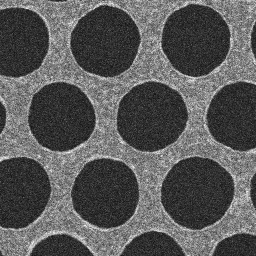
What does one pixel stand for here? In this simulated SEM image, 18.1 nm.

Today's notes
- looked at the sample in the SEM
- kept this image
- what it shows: holes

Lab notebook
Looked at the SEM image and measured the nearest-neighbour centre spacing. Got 1.6 um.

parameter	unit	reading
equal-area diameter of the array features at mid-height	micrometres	1.28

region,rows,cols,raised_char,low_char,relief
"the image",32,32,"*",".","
************************.*******
....*******.....******.....*****
.....*****.......****.......****
......***........***.........***
......***.........**.........**.
......***........***.........**.
......***........***.........***
.....****........****.......****
.....*****......******.....*****
...**********..*********.*******
******...********....********...
*****......*****......*****.....
****.......****........***......
.***........***........***......
.***........***.........**......
.***........***........***......
****........***........***......
****.......****.......*****.....
******...********....********...
********************************
.....******.....******.....*****
......****.......****........***
......***........***.........**.
......***........***.........**.
......***........***.........**.
......***........***.........***
.....*****.......****.......****
....*******.....******.....*****
*..*********..*********..*******
******...********....********...
*****.....******......*****.....
****.......****........****.....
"